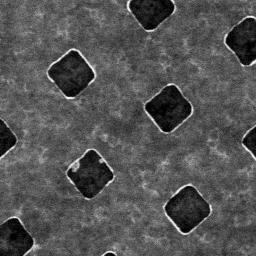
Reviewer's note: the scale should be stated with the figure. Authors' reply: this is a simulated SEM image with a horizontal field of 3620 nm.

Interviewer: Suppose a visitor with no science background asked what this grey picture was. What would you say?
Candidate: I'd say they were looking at holes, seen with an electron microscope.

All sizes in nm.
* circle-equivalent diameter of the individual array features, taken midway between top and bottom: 604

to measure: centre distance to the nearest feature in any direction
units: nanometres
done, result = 1440